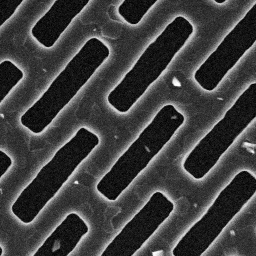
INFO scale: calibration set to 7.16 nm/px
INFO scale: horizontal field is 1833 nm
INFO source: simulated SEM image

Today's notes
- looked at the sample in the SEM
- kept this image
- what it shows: holes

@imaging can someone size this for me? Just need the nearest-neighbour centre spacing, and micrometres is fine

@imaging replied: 0.631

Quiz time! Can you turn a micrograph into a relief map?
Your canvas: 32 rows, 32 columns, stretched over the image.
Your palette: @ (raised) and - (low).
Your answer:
---@@@@----@@@@----@@@@@@@@@@@@@
--@@@@----@@@@@---@@@@@@@@@@@@@-
-@@@@----@@@@@@@--@@@@-@@@@@@@--
@@@@----@@@@@@@@@@@@@---@@@@@---
@@@@---@@@@@@@@@@@@@----@@@@----
@@@@@--@@@@--@@@@@@----@@@@@----
@@@@@@@@@@----@@@@----@@@@@----@
@@@@@@@@@----@@@@----@@@@@----@@
--@@@@@@----@@@@@----@@@@----@@@
---@@@@----@@@@@----@@@@----@@@@
--@@@@-----@@@@----@@@@@@--@@@@@
-@@@@@----@@@@----@@@@@@@@@@@@--
@@@@@----@@@@@---@@@@@@@@@@@@@--
@@@@----@@@@@@--@@@@--@@@@@@@---
@@@----@@@@@@@@@@@@----@@@@@----
@@@---@@@@@@@@@@@@@----@@@@----@
@@@@-@@@@@-@@@@@@@----@@@@----@@
@@@@@@@@@---@@@@@----@@@@----@@@
@@@@@@@@----@@@@----@@@@----@@@@
-@@@@@@----@@@@----@@@@-----@@@@
-@@@@@----@@@@-----@@@@----@@@@@
-@@@@----@@@@@----@@@@@@--@@@@-@
@@@@----@@@@@----@@@@@@@@@@@@---
@@@-----@@@@----@@@@@@@@@@@@----
@@-----@@@@@@--@@@@--@@@@@@-----
@@----@@@@@@@@@@@@----@@@@@----@
@@---@@@@@@@@@@@@----@@@@@----@@
@@@-@@@@--@@@@@@-----@@@@----@@@
@@@@@@@----@@@@-----@@@@----@@@@
@@@@@@-----@@@@----@@@@----@@@@@
@@@@@-----@@@@----@@@@----@@@@@@
@@@@-----@@@@----@@@@@---@@@@@@@